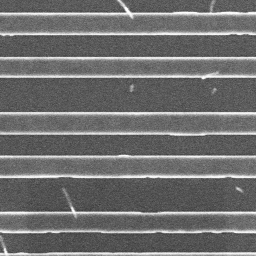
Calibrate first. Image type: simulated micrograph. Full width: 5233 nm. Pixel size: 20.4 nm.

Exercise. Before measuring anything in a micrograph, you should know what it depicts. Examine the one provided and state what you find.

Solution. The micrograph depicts lines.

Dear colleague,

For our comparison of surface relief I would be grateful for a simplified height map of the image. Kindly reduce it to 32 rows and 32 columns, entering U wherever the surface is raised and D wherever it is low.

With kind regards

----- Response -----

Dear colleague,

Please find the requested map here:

DDDDDDDDDDDDDDDDDDDDDDDDDDDDDDDD
DDDDDDDDDDDDDDDDDDDDDDDDDDDDDDDD
UUUUUUUUUUUUUUUUUUUUUUUUUUUUUUUU
UUUUUUUUUUUUUUUUUUUUUUUUUUUUUUUU
DDDDDDDDDDDDDDDDDDDDDDDDDDDDDDDD
DDDDDDDDDDDDDDDDDDDDDDDDDDDDDDDD
DDDDDDDDDDDDDDDDDDDDDDDDDDDDDDDD
UUUUUUUUUUUUUUUUUUUUUUUUUUUUUUUU
UUUUUUUUUUUUUUUUUUUUUUUUUUUUUUUU
UUUUUUUUUUUUUUUUUUUUUUUUUUUUUUUU
DDDDDDDDDDDDDDDDDDDDDDDDDDDDDDDD
DDDDDDDDDDDDDDDDDDDDDDDDDDDDDDDD
DDDDDDDDDDDDDDDDDDDDDDDDDDDDDDDD
DDDDDDDDDDDDDDDDDDDDDDDDDDDDDDDD
UUUUUUUUUUUUUUUUUUUUUUUUUUUUUUUU
UUUUUUUUUUUUUUUUUUUUUUUUUUUUUUUU
UUUUUUUUUUUUUUUUUUUUUUUUUUUUUUUU
DDDDDDDDDDDDDDDDDDDDDDDDDDDDDDDD
DDDDDDDDDDDDDDDDDDDDDDDDDDDDDDDD
DDDDDDDDDDDDDDDUDDDDDDDDDDDDDDDD
UUUUUUUUUUUUUUUUUUUUUUUUUUUUUUUU
UUUUUUUUUUUUUUUUUUUUUUUUUUUUUUUU
DDDDDDDDDDDDDDDDDDDDDDDDDDDDDDDD
DDDDDDDDDDDDDDDDDDDDDDDDDDDDDDDD
DDDDDDDDDDDDDDDDDDDDDDDDDDDDDDDD
DDDDDDDDDDDDDDDDDDDDDDDDDDDDDDDD
DDDDDDDDDUDDDDDDDDDDDDDDDDDDDDDD
UUUUUUUUUUUUUUUUUUUUUUUUUUUUUUUU
UUUUUUUUUUUUUUUUUUUUUUUUUUUUUUUU
DDDDDDDDDDDDDDDDDDDDDDDDDDDDDDDD
DDDDDDDDDDDDDDDDDDDDDDDDDDDDDDDD
DDDDDDDDDDDDDDDDDDDDDDDDDDDDDDDD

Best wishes